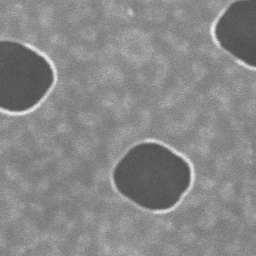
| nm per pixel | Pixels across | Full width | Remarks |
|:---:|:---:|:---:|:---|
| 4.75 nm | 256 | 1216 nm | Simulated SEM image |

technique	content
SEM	holes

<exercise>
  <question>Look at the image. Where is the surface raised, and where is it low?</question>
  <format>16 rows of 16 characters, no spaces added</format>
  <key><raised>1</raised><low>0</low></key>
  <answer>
1111111111111100
1111111111111100
1111111111111100
0001111111111110
0001111111111111
0001111111111111
0011111111111111
1111111111111111
1111111111111111
1111111100011111
1111111000001111
1111111000001111
1111111100011111
1111111111111111
1111111111111111
1111111111111111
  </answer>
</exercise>